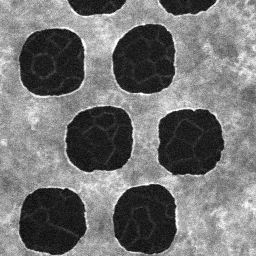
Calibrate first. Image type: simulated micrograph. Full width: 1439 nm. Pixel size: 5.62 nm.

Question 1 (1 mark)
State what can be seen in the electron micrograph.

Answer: holes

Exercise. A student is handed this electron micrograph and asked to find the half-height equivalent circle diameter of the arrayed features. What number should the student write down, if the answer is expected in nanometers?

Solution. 392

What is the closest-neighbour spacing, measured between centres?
506 nanometers